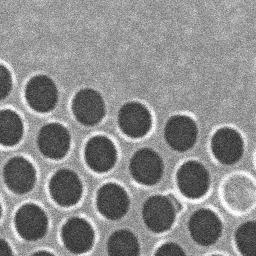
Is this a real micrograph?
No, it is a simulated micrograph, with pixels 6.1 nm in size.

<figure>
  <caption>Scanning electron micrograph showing a regular array of holes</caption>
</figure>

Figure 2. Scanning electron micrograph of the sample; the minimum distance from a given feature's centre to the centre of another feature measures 0.293 µm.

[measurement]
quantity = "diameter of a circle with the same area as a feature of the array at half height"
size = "0.229 micrometres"